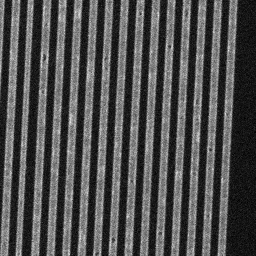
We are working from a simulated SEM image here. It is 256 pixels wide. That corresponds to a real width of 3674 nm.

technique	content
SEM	parallel lines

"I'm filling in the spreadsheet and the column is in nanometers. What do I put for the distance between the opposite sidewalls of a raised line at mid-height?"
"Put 96.8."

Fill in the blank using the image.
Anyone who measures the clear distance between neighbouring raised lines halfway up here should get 124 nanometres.